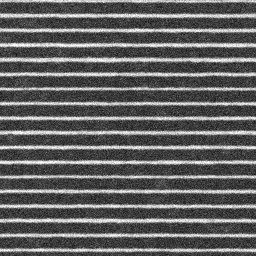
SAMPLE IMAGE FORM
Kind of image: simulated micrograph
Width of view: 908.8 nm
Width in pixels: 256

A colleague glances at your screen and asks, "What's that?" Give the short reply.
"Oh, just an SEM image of parallel lines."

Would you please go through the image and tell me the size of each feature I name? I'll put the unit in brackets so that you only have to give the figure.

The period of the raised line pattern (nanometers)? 52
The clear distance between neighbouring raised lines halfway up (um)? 0.0426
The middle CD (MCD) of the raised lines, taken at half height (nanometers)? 10.2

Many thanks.